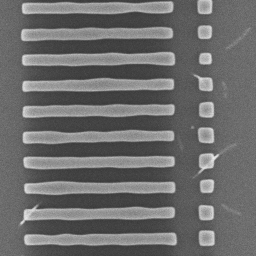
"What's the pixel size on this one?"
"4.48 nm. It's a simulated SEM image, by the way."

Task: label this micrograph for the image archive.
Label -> groups of lines, slits or small figures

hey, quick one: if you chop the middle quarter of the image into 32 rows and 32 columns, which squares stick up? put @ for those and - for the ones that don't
-@@-----------------------------
--------------------------------
--------------------------------
---------@@---------------------
@@@@@@@@@@@@@@@@@@@@@@@@@@@-----
@@@@@@@@@@@@@@@@@@@@@@@@@@@-----
@@@@@@@@@@@@--------------------
--------------------------------
--------------------------------
--------------------------------
@@@@@@@@@@@@@@@@@@@@@@@@@@@-----
@@@@@@@@@@@@@@@@@@@@@@@@@@@-----
@@@@@@@@@@@@@@@@@@@@@@@@@@@-----
--------------------------------
--------------------------------
--------------------------------
--------------------------------
@@@@@@@@@@@@@@@@@@@@@@@@@@@-----
@@@@@@@@@@@@@@@@@@@@@@@@@@@-----
@-------------------------------
--------------------------------
--------------------------------
--------------------------------
@@@@@@@@@@@@@@@@@@@@@@@@@@@-----
@@@@@@@@@@@@@@@@@@@@@@@@@@@-----
@@@@@@@@@@@@@@@@@@@@@@@@@@@-----
--------------------------------
--------------------------------
--------------------------------
@-------------------------------
@@@@@@@@@@@@@@@@@@@@@@@@@@@@----
@@@@@@@@@@@@@@@@@@@@@@@@@@@@----